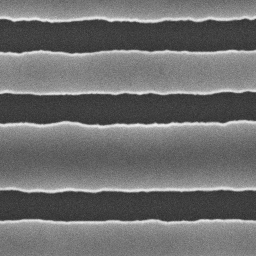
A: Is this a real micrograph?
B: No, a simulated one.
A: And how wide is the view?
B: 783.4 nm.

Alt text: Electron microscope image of lines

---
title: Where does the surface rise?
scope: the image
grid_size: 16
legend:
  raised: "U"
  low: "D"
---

UUUUUUUUUUUUUUUU
DDDDDDDDDDDDDDDD
DDDDDDDDDDDDDDDD
UUUUUUUUUUUUUUUU
UUUUUUUUUUUUUUUU
UUUUUUUUUUUUUUUU
DDDDDDDDDDDDDDDD
DDDDDDDDDDDDDDDD
UUUUUUUUUUUUUUUU
UUUUUUUUUUUUUUUU
UUUUUUUUUUUUUUUU
UUUUUUUUUUUUUUUU
DDDDDDDDDDDDDDDD
DDDDDDDDDDDDDDDD
UUUUUUUUUUUUUUUU
UUUUUUUUUUUUUUUU